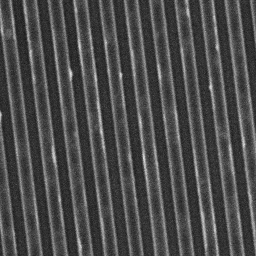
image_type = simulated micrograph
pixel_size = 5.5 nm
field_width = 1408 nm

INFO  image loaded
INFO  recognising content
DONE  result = parallel lines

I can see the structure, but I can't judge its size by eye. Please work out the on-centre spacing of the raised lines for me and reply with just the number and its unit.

138 nm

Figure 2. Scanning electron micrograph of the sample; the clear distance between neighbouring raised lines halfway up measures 62.7 nanometers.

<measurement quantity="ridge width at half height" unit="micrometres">0.0729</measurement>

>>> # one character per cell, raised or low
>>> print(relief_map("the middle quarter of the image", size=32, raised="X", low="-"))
X---XXXX---XXX---XXX---XXXX---XX
XX---XXX---XXX---XXX----XXX---XX
XX---XXX---XXX---XXX----XXX---XX
XX---XXX---XXX---XXXX---XXX---XX
XX---XXX---XXX----XXX---XXX---XX
XX---XXX---XXXX---XXX---XXX---XX
XX---XXX----XXX---XXX---XXX---XX
XX---XXXX---XXX---XXX---XXXX---X
XX----XX----XXX---XXX---XXXX---X
XX----XXX---XXX---XXX----XXX---X
XXX---XXX---XXX---XXX----XXX---X
XXX---XXX---XXX----XXX---XXX---X
XXX---XXX---XXX----XXX---XXX---X
XXX---XXX---XXXX---XXX---XXX---X
XXX---XXX---XXXX---XXX---XXX---X
XXX---XXX----XXX---XXX---XXXX---
XXX----XX----XXX---XXX---XXXX---
XXX----XXX---XXX---XXX----XXX---
XXX----XXX---XXX---XXX----XXX---
XXXX---XXX---XXX---XXXX---XXX---
-XXX---XXX---XXX----XXX---XXX---
-XXX---XXX---XXXX---XXX---XXX---
-XXX---XXX---XXXX---XXX---XXX---
-XXX---XXXX---XXX---XXX---XXX---
-XXX---XXXX---XXX---XXX---XXXX--
-XXX---XXXX---XXX---XXX----XXX--
-XXX----XXX---XXX---XXX----XXX--
-XXXX---XXX---XXX---XXXX---XXX--
-XXXX---XXX---XXX---XXXX---XXX--
--XXX---XXX---XXXX---XXX---XXX--
--XXX---XXX---XXXX---XXX---XXX--
--XXX---XXX----XXX---XXX---XXX--